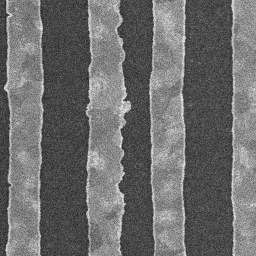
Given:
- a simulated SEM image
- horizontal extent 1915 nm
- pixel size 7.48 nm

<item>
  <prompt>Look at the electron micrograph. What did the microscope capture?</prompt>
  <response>one or a few lines or trenches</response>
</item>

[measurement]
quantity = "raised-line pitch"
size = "0.536 µm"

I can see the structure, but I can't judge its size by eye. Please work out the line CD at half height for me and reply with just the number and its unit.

0.234 µm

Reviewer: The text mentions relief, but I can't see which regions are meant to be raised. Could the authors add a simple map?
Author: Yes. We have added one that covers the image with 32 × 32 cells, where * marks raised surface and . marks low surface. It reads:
.****......****....****......***
.****......****....****......***
.****......****....****......***
.****......****....****......***
.****......****....****......***
.****......****....****......***
.****......*****...****......***
.****.......***....****......***
.****......****....****......***
.****......****....****......***
.****......*****...****......***
.****......*****...****......***
.****......*****...****......***
.****......*****...****......***
.****......****....****......***
.****......****....****......***
.****......****....****......***
.****......****....****......***
.****......****....****......***
.****......****....****......***
.****......****....****......***
.****......****....****......***
.****......****....****......***
.****......****....****......***
.****......****....****......***
.****......****....****......***
.****......****....****......***
.****......****....****......***
.****......****....****......***
.****......****....****......***
.****......****....****......***
.****......****....****......***